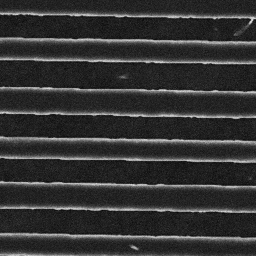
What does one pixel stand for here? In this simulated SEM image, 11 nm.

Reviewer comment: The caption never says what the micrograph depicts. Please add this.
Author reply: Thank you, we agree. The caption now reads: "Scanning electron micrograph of lines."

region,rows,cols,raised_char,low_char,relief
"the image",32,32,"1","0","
11111111111111111111111111111111
11111111111111111111111111111111
00000000000000000000000000000000
00000000000000000000000000000000
00000000000000000000000000000000
11111111111111111111111111111111
11111111111111111111111111111111
00000111111111111111111111111111
00000000000000000000000000000000
00000000000000000000000000000000
00000000000000000000000000000000
11111111111111111111111111111101
11111111111111111111111111111111
11111111111111111111111111111111
00000000000000001111111111111111
00000000000000000000000000000000
00000000000000000000000000000000
11111111111111111110000000000000
11111111111111111111111111111111
11111111111111111111111111111111
00000000000000000000000000000000
00000000000000000000000000000000
00000000000000000000000000000000
11111111111111111111111111111111
11111111111111111111111111111111
11111111111111111111111111111111
00000000000000000000000000000000
00000000000000000000000000000000
00000000000000000000000000000000
11111111111110000000000000000000
11111111111111111111111111111111
11111111111111111111111111111111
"